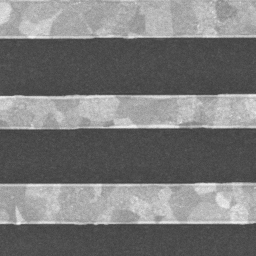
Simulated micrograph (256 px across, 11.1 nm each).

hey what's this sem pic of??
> lines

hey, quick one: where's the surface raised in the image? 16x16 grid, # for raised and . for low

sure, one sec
################
################
................
................
................
................
################
################
................
................
................
................
################
################
................
................